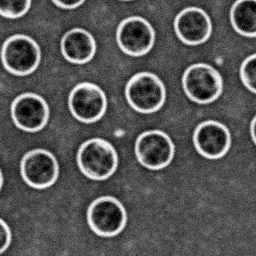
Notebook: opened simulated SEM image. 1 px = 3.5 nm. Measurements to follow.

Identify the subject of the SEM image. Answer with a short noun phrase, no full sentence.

a regular array of raised bodies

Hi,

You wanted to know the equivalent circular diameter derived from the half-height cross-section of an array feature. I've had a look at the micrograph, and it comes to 0.123 micrometres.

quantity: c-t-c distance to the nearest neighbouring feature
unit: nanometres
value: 201